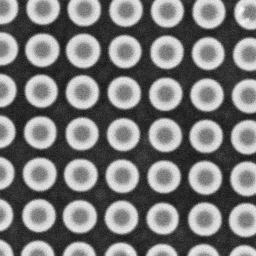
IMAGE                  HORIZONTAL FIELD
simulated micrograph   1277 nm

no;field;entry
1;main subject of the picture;an array of small figures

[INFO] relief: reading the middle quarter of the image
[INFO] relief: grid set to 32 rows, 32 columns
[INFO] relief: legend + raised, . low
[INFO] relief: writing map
...++++......++++.......++++....
................................
................................
...++++.......++................
.+++++++....++++++.....+++++....
.+++++++...++++++++...+++++++...
.++++++++..++++++++...+++++++...
.++++++++..++++++++..++++++++...
.+++++++...++++++++..++++++++...
.+++++++....++++++....+++++++...
..+++++......++++......+++++....
.........................+......
................................
................................
..+++++.....+++++......++++.....
.+++++++...+++++++....++++++....
.+++++++...++++++++..++++++++...
.+++++++...++++++++..++++++++...
.+++++++...++++++++..++++++++...
.+++++++...+++++++....+++++++...
..+++++.....++++++....++++++....
..............++........+++.....
................................
................................
..++++......++++.......+++......
.+++++++...+++++++....++++++....
++++++++...+++++++...++++++++...
++++++++...++++++++..++++++++..+
++++++++...++++++++..++++++++..+
.+++++++...+++++++...++++++++..+
.++++++....+++++++....++++++....
...++.......+++++......++++.....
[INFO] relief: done